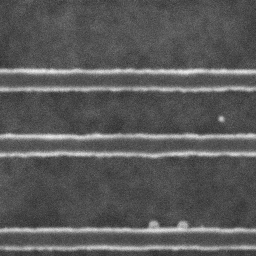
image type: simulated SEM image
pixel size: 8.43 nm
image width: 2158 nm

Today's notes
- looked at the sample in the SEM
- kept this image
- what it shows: lines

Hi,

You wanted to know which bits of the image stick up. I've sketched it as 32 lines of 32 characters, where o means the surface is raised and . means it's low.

................................
................................
................................
................................
................................
................................
................................
................................
................................
oooooooooooooooooooooooooooooooo
oooooooooooooooooooooooooooooooo
................................
................................
................................
................................
................................
................................
oooooooooooooooooooooooooooooooo
oooooooooooooooooooooooooooooooo
..................oo............
................................
................................
................................
................................
................................
................................
................................
................................
................................
oooooooooooooooooooooooooooooooo
oooooooooooooooooooooooooooooooo
................................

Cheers